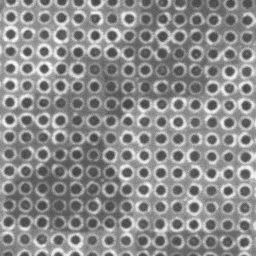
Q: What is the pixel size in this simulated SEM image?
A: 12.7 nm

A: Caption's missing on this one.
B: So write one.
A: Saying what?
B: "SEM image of a regular array of holes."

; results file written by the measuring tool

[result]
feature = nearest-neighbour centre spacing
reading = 212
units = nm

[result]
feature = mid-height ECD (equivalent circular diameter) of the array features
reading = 0.142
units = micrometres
